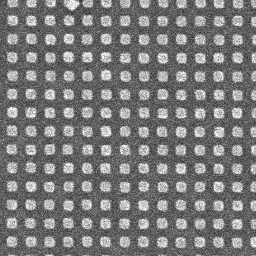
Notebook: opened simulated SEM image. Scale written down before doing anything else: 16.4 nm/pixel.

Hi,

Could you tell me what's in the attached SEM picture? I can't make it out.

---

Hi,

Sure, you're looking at a regular array of raised bodies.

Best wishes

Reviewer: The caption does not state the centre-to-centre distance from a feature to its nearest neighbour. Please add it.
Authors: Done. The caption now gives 295 nanometres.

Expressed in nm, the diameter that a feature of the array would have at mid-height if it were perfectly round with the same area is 171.